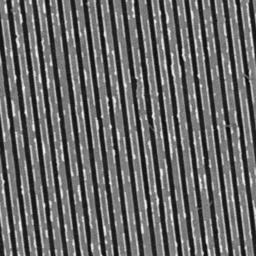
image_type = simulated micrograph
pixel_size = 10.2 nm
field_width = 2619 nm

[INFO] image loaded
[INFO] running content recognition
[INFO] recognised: parallel lines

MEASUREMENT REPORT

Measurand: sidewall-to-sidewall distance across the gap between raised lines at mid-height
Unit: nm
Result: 52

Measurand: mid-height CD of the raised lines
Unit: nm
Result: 73.6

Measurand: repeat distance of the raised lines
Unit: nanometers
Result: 129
